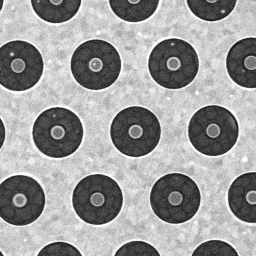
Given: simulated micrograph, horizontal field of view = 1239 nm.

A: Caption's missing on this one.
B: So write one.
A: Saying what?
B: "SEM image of an array of small figures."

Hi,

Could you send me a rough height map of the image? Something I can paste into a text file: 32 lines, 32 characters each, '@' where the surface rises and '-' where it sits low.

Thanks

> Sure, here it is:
@@@@------@@@@------@@@-------@@
@@@@------@@@@-----@@@@@-----@@@
@@@@@----@@@@@@---@@@@@@@---@@@@
@@@@@@@@@@@@@@@@@@@@@@@@@@@@@@@@
@@@@@@@@@@@@@@@@@@@@@@@@@@@@@@@@
@---@@@@@@----@@@@@@----@@@@@---
-----@@@@------@@@@------@@@@---
--@--@@@@------@@@@--@---@@@---@
--@--@@@@--@@--@@@@--@---@@@---@
-----@@@@------@@@@-----@@@@@---
-----@@@@@----@@@@@@----@@@@@---
@@-@@@@@@@@@@@@@@@@@@@@@@@@@@@@@
@@@@@@@@@@@@@@@@@@@@@@@@@@@@@@@@
@@@@@@--@@@@@@@@--@@@@@@@---@@@@
@@@@@-----@@@@-----@@@@@-----@@@
@@@@------@@@@------@@@@------@@
-@@@---@---@@@--@@--@@@---@---@@
-@@@------@@@@------@@@@------@@
@@@@------@@@@-----@@@@@-----@@@
@@@@@@---@@@@@@@--@@@@@@@@-@@@@@
@@@@@@@@@@@@@@@@@@@@@@@@@@@@@@@@
@@@@@@@@@@@@@@@@@@@@@@@@@@@@@@@-
@----@@@@@----@@@@@@----@@@@@---
-----@@@@------@@@@------@@@@---
--@---@@@---@--@@@@--@@--@@@---@
--@---@@@---@--@@@@------@@@----
-----@@@@------@@@@------@@@@---
----@@@@@@----@@@@@@----@@@@@@--
@@@@@@@@@@@@@@@@@@@@@@@@@@@@@@@@
@@@@@@@@@@@@@@@@@@@@@@@@@@@@@@@@
@@@@@@---@@@@@@----@@@@@@----@@@
@@@@@-----@@@@------@@@@------@@